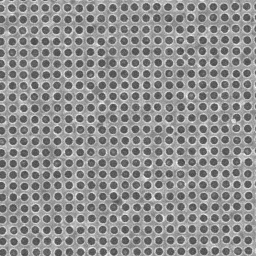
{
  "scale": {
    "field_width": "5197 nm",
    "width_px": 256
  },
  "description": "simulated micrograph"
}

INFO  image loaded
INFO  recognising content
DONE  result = a regular array of holes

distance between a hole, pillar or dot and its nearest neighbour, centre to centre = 218 nm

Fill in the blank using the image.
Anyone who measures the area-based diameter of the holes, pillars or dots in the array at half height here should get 167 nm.